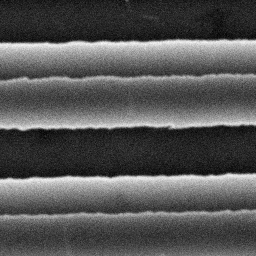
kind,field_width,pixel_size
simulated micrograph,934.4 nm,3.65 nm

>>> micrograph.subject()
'lines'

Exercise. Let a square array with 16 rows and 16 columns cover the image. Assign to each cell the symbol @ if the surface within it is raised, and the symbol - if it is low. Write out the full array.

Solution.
----------------
----------------
----------------
@@@@@@@@@@@@@@@@
@@@@@@@@@@@@@@@@
@@@@@@@@@@@@@@@@
@@@@@@@@@@@@@@@@
@@@@@@@@@@@@@@@@
----------------
----------------
----------------
@@@@@@@@@@@@@@@@
@@@@@@@@@@@@@@@@
@@@@@@@@@@@@@@@@
@@@@@@@@@@@@@@@@
@@@@@@@@@@@@@@@@